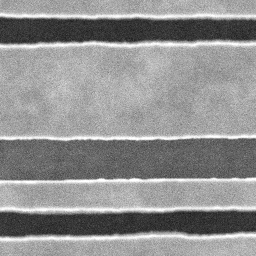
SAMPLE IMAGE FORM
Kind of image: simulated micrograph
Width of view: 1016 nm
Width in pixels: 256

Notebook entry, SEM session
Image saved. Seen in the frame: lines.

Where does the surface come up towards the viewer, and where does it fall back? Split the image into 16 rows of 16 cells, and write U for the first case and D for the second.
UUUUUUUUUUUUUUUU
DDDDDDDDDDDDDDDD
DDDDDDDDDDDDDDDD
UUUUUUUUUUUUUUUU
UUUUUUUUUUUUUUUU
UUUUUUUUUUUUUUUU
UUUUUUUUUUUUUUUU
UUUUUUUUUUUUUUUU
UUUUUUUUUUUUUUUU
DDDDDDDDDDDDDDDD
DDDDDDDDDDDDDDDD
UUUUUUUUUUUUUUUU
UUUUUUUUUUUUUUUU
DDDDDDDDDDDDDDDD
DDDDDDDDDDDDDDDD
UUUUUUUUUUUUUUUU